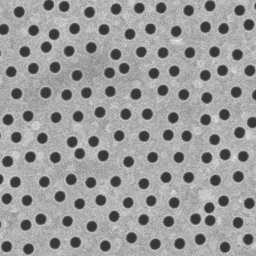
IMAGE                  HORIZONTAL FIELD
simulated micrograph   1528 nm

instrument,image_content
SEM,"a regular array of holes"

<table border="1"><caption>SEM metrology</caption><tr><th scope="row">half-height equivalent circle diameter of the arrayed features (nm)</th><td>65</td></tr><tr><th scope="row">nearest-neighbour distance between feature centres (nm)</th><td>122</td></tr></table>